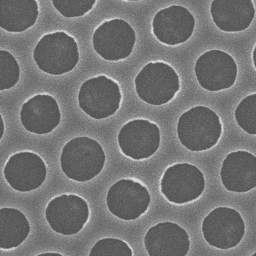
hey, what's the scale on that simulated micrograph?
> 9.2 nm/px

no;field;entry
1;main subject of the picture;a regular array of holes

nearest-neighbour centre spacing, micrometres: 0.538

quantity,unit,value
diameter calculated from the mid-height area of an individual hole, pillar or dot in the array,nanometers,387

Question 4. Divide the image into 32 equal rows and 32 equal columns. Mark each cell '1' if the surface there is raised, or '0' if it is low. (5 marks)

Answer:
00000110000011111111111111000000
00000110000111111111000011000000
00000111111111011110000011100000
00001111111100001110000011100001
11111100011100000110000011111111
11111000001100000111101111111111
01110000001100001111111111001111
00110000001110011111111110000111
00111000011111111100011100000011
00111111111111111000001110000011
00111111110000011000001110000111
11111111110000011000001111111111
11110001110000011100011111111100
11100001110000011111111100111100
11100000111000111111111000011000
11100001111111110001110000001100
11110011111111100000110000001110
11111111100011100000110000011111
11111111000001100000111000111111
11000111000001110001111111110000
10000011000001111111110011110000
10000011000011111111100001110000
10000011100111101111000000110000
11000111111111000011000000110000
11111111001110000001100001111111
11111100000110000001111111111111
00011100000111000011111111000011
00011100000111111111111110000011
00001100001111111110000110000001
00011111111111111100000010000011
00011111111100001100000011000011
11111111111000001100000111111111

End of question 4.